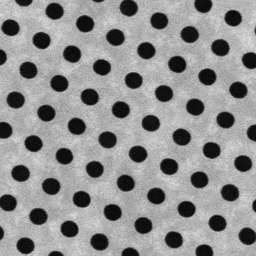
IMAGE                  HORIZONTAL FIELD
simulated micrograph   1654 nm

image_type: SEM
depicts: a regular array of holes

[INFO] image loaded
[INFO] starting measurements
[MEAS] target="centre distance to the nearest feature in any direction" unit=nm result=208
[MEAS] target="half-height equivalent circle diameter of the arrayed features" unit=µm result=0.11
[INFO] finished